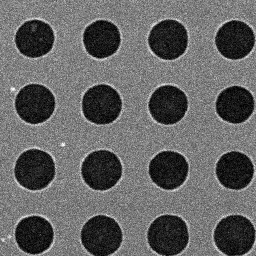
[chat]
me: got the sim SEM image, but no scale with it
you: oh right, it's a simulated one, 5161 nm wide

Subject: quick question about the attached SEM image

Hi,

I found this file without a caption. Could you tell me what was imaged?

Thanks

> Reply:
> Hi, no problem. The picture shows a regular array of holes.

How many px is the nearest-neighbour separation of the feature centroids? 65.2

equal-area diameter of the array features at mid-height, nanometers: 807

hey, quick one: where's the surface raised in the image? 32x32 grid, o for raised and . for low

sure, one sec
oooooooooooooooooooooooooooooooo
oooooooooooooooooooooooooooooooo
oooo.oooooooooooooooo.oooooooooo
oo....ooooo....oooo....oooo....o
oo.....ooo.....oooo....oooo.....
oo.....ooo.....oooo....oooo.....
oo....ooooo...ooooo....oooo....o
oooooooooooooooooooooooooooooooo
oooooooooooooooooooooooooooooooo
oooooooooooooooooooooooooooooooo
oooo.ooooooooooooooooooooooooooo
oo....ooooo....oooo....ooooo...o
oo.....ooo.....oooo....oooo.....
oo.....ooo.....oooo....oooo.....
oo....ooooo....oooo....oooo....o
oooo.ooooooo..oooooo..oooooooooo
oooooooooooooooooooooooooooooooo
oooooooooooooooooooooooooooooooo
oooooooooooooooooooooooooooooooo
oo....ooooo....oooo....ooooo...o
oo.....ooo.....oooo.....ooo.....
oo.....ooo.....oooo.....ooo.....
oo.....ooo.....oooo....oooo.....
ooo...ooooo...oooooo..oooooo...o
oooooooooooooooooooooooooooooooo
oooooooooooooooooooooooooooooooo
oooooooooooooooooooooooooooooooo
ooo...ooooo...ooooo....ooooo...o
oo.....ooo.....oooo....oooo.....
oo.....ooo.....ooo......ooo.....
oo....oooo.....oooo.....ooo.....
ooo...ooooo...ooooo....ooooo...o